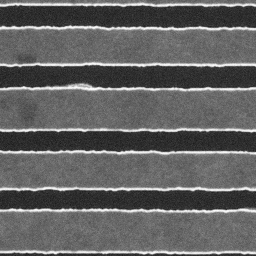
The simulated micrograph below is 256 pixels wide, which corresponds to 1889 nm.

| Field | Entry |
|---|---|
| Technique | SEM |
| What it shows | lines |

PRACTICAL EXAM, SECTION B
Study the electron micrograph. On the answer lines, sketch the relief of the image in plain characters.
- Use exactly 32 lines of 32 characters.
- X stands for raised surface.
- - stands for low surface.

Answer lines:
XXXXXXXXXXXXXXXXXXXXXXXXXXXXXXXX
--------------------------------
--------------------------------
XXXXXXXXXXXXXXXXXXXX---XXX-XX---
XXXXXXXXXXXXXXXXXXXXXXXXXXXXXXXX
XXXXXXXXXXXXXXXXXXXXXXXXXXXXXXXX
XXXXXXXXXXXXXXXXXXXXXXXXXXXXXXXX
XXXXXXXXXXXXXXXXXXXXXXXXXXXXXXXX
--------------------------------
--------------------------------
--------------------------------
XXXXXXXXXXXXXXXXXXXXXXXXXXXXXXXX
XXXXXXXXXXXXXXXXXXXXXXXXXXXXXXXX
XXXXXXXXXXXXXXXXXXXXXXXXXXXXXXXX
XXXXXXXXXXXXXXXXXXXXXXXXXXXXXXXX
XXXXXXXXXXXXXXXXXXXXXXXXXXXXXXXX
--------------------------------
--------------------------------
--------------------------------
XXXXXXXXXXXXXXXXXXXXXXXXXXXXXXXX
XXXXXXXXXXXXXXXXXXXXXXXXXXXXXXXX
XXXXXXXXXXXXXXXXXXXXXXXXXXXXXXXX
XXXXXXXXXXXXXXXXXXXXXXXXXXXXXXXX
XXXXXXXXXXXXXXXXXXXXXXXXXXXXXXXX
--------------------------------
--------------------------------
XXXXXXXXXXXXXXXXXXXXXXXXXXXXXXXX
XXXXXXXXXXXXXXXXXXXXXXXXXXXXXXXX
XXXXXXXXXXXXXXXXXXXXXXXXXXXXXXXX
XXXXXXXXXXXXXXXXXXXXXXXXXXXXXXXX
XXXXXXXXXXXXXXXXXXXXXXXXXXXXXXXX
XXXXXXXXXXXXXXXXXXXXXXXXXXXXXXXX